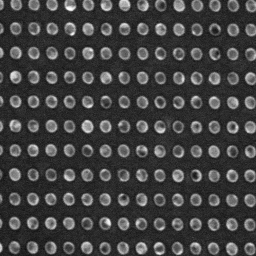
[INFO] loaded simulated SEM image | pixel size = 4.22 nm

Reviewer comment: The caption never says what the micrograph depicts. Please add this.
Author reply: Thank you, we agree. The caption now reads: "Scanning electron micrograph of a regular array of raised bodies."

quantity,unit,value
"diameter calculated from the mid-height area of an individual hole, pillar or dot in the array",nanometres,46.9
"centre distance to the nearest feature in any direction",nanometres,75.8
